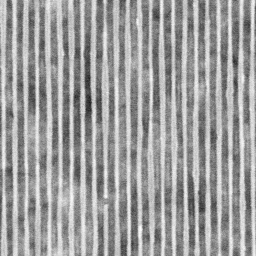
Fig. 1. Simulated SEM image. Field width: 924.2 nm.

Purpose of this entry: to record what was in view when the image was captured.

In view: parallel lines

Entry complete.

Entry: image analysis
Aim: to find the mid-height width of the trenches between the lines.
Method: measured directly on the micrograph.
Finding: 0.0271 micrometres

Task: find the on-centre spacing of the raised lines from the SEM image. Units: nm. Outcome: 41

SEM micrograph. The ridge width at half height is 13.5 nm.